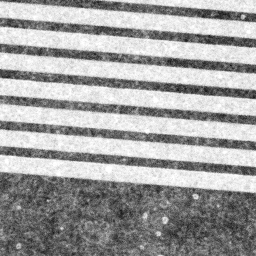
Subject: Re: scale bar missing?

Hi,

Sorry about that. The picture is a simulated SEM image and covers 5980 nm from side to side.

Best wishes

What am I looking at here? parallel lines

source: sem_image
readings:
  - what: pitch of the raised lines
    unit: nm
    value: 598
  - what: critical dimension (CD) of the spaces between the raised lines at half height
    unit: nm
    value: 230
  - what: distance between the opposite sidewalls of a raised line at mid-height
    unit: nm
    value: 361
